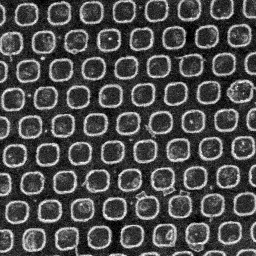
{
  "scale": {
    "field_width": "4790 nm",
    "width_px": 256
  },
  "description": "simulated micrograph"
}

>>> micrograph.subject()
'a regular array of raised bodies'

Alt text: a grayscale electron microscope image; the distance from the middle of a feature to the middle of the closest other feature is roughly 604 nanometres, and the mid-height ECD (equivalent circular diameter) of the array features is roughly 418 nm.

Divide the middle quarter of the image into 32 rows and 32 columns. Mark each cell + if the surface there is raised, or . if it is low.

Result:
++...+++++...+++++...+++++...+++
++...+++++...+++++...+++++...+++
++...+++++...+++++...+++++....++
+.....+++.....++................
................................
..................++++....++++..
..++++....++++...+++++....++++..
.+++++...+++++...+++++....+++++.
.+++++...+++++...+++++...++++++.
.+++++...+++++...+++++....++++..
..+++.....+.....................
................................
...............+++.....+++....++
++....++++....+++++...+++++...++
++...++++++...+++++...+++++...++
++...++++++...+++++..++++++...++
++...+++++....++++....++++....++
++....+++.......................
................................
...................+++.....++++.
..++++....+++++...+++++...+++++.
..+++++...+++++...+++++...+++++.
..+++++...+++++...+++++...+++++.
..+++++...+++++...+++++...+++++.
..++++.....++......++...........
................................
.......................++++....+
++....+++++...+++++...+++++...++
+++...+++++...+++++...+++++...++
+++..++++++...+++++...+++++...++
+++...+++++...+++++...+++++....+
++....++++.....++.........+.....